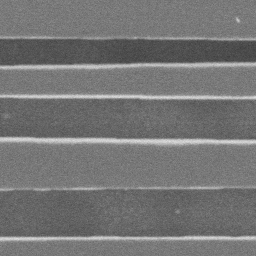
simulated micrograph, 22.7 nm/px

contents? lines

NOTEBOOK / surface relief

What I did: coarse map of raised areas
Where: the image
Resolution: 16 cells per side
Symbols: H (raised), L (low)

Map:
HHHHHHHHHHHHHHHH
HHHHHHHHHHHHHHHH
LLLLLLLLLLLLLLLL
LLLLLLLLLLLLLLLL
HHHHHHHHHHHHHHHH
HHHHHHHHHHHHHHHH
LLLLLLLLLLLLLLLL
LLLLLLLLLLLLLLLL
LLLLLLLLLLLLLLLL
HHHHHHHHHHHHHHHH
HHHHHHHHHHHHHHHH
HHHHHHHHHHHHHHHH
LLLLLLLLLLLLLLLL
LLLLLLLLLLLLLLLL
LLLLLLLLLLLLLLLL
HHHHHHHHHHHHHHHH